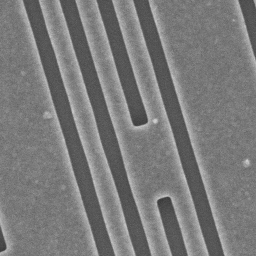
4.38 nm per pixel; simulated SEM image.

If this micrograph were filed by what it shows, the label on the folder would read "groups of lines, slits or small figures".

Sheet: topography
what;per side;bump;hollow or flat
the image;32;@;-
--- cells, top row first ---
@@@--@@@--@@--@@@--@@@@@@@@@@@--
@@@--@@@--@@---@@--@@@@@@@@@@@--
@@@@--@@--@@@--@@--@@@@@@@@@@@@-
@@@@--@@@--@@--@@@--@@@@@@@@@@@-
@@@@--@@@--@@--@@@--@@@@@@@@@@@-
@@@@@--@@--@@@--@@--@@@@@@@@@@@-
@@@@@--@@--@@@--@@@--@@@@@@@@@@@
@@@@@--@@@--@@--@@@--@@@@@@@@@@@
@@@@@--@@@--@@@--@@--@@@@@@@@@@@
@@@@@@--@@--@@@--@@--@@@@@@@@@@@
@@@@@@--@@@--@@--@@@--@@@@@@@@@@
@@@@@@--@@@--@@--@@@--@@@@@@@@@@
@@@@@@@--@@--@@@--@@--@@@@@@@@@@
@@@@@@@--@@@--@@--@@@--@@@@@@@@@
@@@@@@@--@@@--@@--@@@--@@@@@@@@@
@@@@@@@--@@@--@@@-@@@--@@@@@@@@@
@@@@@@@@--@@--@@@@@@@@--@@@@@@@@
@@@@@@@@--@@@--@@@@@@@--@@@@@@@@
@@@@@@@@--@@@--@@@@@@@--@@@@@@@@
@@@@@@@@@--@@--@@@@@@@--@@@@@@@@
@@@@@@@@@--@@@--@@@@@@@--@@@@@@@
@@@@@@@@@--@@@--@@@@@@@--@@@@@@@
@@@@@@@@@@--@@--@@@@@@@--@@@@@@@
@@@@@@@@@@--@@@-@@@@@@@@--@@@@@@
@@@@@@@@@@--@@@--@@@@@@@--@@@@@@
@@@@@@@@@@--@@@--@@@--@@--@@@@@@
@@@@@@@@@@@--@@--@@@--@@@--@@@@@
@@@@@@@@@@@--@@@--@@--@@@--@@@@@
@@@@@@@@@@@--@@@--@@---@@--@@@@@
-@@@@@@@@@@@--@@--@@@--@@--@@@@@
-@@@@@@@@@@@--@@@--@@--@@@--@@@@
@@@@@@@@@@@@--@@@--@@--@@@--@@@@